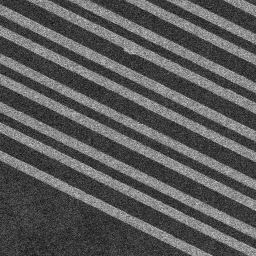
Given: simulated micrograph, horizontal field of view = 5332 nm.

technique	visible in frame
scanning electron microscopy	parallel lines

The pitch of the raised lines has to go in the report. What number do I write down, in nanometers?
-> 454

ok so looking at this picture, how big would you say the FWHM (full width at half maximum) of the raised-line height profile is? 184 nm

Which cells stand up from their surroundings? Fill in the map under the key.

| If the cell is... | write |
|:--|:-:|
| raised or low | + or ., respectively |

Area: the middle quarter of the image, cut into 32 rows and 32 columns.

++++......+++++.........+++++...
..++++......+++++.........+++++.
....++++......+++++.........++++
......++++......+++++.........++
........++++......+++++.........
..........++++......+++++.......
++..........++++......+++++.....
++++..........++++......+++++...
..++++..........++++......+++++.
....++++..........++++......++++
......++++..........++++......++
++......++++..........++++......
++++......++++..........++++....
.+++++......++++..........++++..
...+++++......++++..........++++
.....+++++......++++..........++
.......+++++......++++..........
.........+++++......++++........
++.........+++++......++++......
++++.........+++++......++++....
.+++++.........+++++......++++..
...+++++..........++++......++++
.....+++++..........++++......++
++.....+++++..........++++......
++++.....+++++..........++++....
.+++++.....+++++..........++++..
...+++++.....+++++..........++++
.....+++++.....+++++..........++
.......+++++.....+++++..........
.........+++++......++++........
++.........+++++......++++......
++++.........+++++......++++....